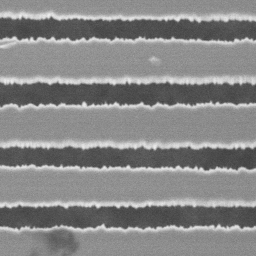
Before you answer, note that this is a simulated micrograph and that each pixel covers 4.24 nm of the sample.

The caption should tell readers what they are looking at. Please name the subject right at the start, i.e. lines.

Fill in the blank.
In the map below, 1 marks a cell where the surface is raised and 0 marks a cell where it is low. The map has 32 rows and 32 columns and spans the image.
11111111111111111111111111111111
11111111111111111111111111111111
00000000000000000000000011000001
00000000000000000000000000000000
00000000000000000000000000000000
11111111111111111111111111111111
11111111111111111111111111111111
11111111111111111111111111111111
11111111111111111111111111111111
11111111111111111111111111111111
00000000000000000000000000000000
00000000000000000000000000000000
00000000000000000000000000000000
11111111111111111111111111111111
11111111111111111111111111111111
11111111111111111111111111111111
11111111111111111111111111111111
11111111111111111111111111111111
00000000000000000000000000000000
00000000000000000000000000000000
00000000000000000000000000000000
11111111111111111111111111111111
11111111111111111111111111111111
11111111111111111111111111111111
11111111111111111111111111111111
11111111111111111111111011111111
00000000000000000000000000000000
00000000000000000000000000000000
10011011110111101011111111111111
11111111111111111111111111111111
11111111111111111111111111111111
11111111111111111111111111111111